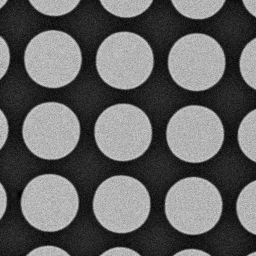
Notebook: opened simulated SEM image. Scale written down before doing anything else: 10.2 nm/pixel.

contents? an array of small figures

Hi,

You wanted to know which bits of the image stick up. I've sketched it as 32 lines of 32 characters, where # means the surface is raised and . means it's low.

#...######...######...######...#
.....####.....####....#####....#
................................
................................
....#####.....###......###......
#...######...######...#####....#
#..#######..#######..#######..##
#..#######..#######..#######..##
#..#######..#######..#######..##
....######...######..#######..##
.....###.....#####....#####....#
................................
................................
....#####....####......###......
#..######...######....#####....#
#..#######..#######..#######..##
#..#######..#######..#######..##
#..#######..#######..#######..##
....#####...######...#######..##
.....###.....####.....#####....#
................................
................................
....####.....####......###......
...######...######...######....#
#..#######..#######..#######..##
#..#######..#######..#######..##
#..#######..#######..#######..##
...######...######...######...##
....####.....####.....####.....#
................................
................................
....####.....####.....###.......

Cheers